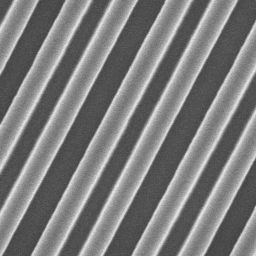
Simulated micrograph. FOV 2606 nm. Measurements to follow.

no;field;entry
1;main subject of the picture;lines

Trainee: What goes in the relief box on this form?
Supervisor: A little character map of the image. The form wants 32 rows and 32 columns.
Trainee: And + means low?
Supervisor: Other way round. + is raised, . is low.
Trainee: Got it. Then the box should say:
..++....+++...+++....+++..+++...
.+++...+++...+++....+++...+++...
.++....+++...+++...++++..+++....
+++...+++...+++....+++...+++....
++....+++...+++...++++..+++....+
++...+++...+++....+++...+++....+
+....+++...+++...+++...+++....++
+...+++...+++....+++...+++....++
....+++...+++...+++...+++....+++
...+++...+++....+++...+++...+++.
...+++...+++...+++...+++....+++.
..+++...+++....+++...+++...+++..
..+++..+++....+++...+++....+++..
.+++...+++....+++...+++...+++...
.+++..+++....+++...+++....+++...
+++...+++....+++..+++....+++...+
++...+++....+++...+++....+++...+
++...+++....+++..+++....+++...++
++..+++....+++...+++....+++...++
+...+++....+++..+++....+++...+++
...+++....+++...+++....+++..+++.
...+++...++++..+++....+++...+++.
..+++....+++...+++....+++..+++..
..+++...+++...+++....+++...+++..
.+++....+++...+++....++...+++...
.+++...+++...+++....+++...+++...
+++....+++...+++...+++...+++....
+++...+++...+++....+++...+++...+
++....+++...+++...+++...+++....+
++...+++...+++....+++...+++...++
+....+++...+++...+++...+++....++
+...+++...+++....+++...+++...+++